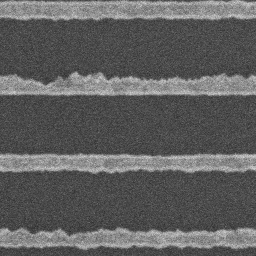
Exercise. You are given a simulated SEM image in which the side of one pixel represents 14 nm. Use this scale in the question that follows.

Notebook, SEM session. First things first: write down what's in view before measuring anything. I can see one or a few lines or trenches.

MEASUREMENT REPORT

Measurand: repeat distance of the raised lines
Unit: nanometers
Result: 1070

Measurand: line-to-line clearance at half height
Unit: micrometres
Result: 0.883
